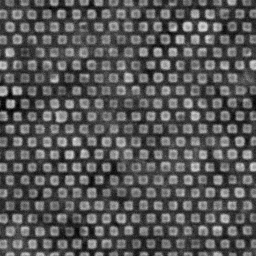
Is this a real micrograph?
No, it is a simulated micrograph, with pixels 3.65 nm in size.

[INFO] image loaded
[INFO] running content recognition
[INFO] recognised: a regular array of raised bodies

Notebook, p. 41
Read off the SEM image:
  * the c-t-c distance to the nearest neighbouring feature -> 51.8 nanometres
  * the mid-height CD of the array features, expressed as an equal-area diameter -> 0.0322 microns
